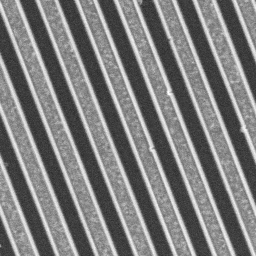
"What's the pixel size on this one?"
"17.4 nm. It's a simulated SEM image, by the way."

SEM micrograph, parallel lines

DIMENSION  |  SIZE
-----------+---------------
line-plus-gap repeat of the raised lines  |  0.637 um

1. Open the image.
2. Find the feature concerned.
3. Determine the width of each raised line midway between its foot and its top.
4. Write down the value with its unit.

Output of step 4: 310 nm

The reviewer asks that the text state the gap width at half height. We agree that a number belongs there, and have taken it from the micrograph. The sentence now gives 0.326 micrometres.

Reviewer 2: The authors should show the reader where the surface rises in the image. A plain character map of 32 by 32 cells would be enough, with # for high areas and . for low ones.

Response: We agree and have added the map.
##...##...##...##...##..###..###
###..###..##...##...##...##...##
.##...##...##..###..###..###..##
.###..##...##...##...##...##...#
.###..###..###..###..##...##...#
..##...##...##...##...##..###..#
..###..###..##...##...##...##...
...##...##..###..###..###..###..
...##...##...##...##...##...##..
#..###..###..###..###..##...##..
#...##...##...##...##..###..###.
##..###..##...##...##...##...##.
##...##..###..###..###..###..###
##...##...##...##...##...##...##
###..###..###..###..##...##...##
.##...##...##...##..###..###..##
.###..###..##...##...##...##...#
..##..###..###..###..###..###..#
..##...##...##...##...##...##..#
..###..###..###..##...##...##...
...##...##...##..###..###..###..
#..##...##...##...##...##...##..
#..###..###..###..###..###..##..
#...##...##...##...##...##..###.
##..###..###..##...##...##...##.
##...##...##..###..###..###..###
##...##...##...##...##...##...##
###..###..###..###..###..##...##
.##...##...##...##...##..###..##
.###..###..##...##...##...##...#
..##...##..###..###..###..###..#
..##...##...##...##...##...##...